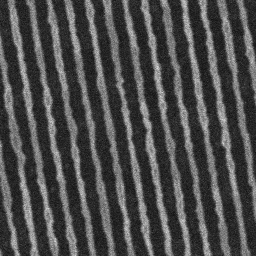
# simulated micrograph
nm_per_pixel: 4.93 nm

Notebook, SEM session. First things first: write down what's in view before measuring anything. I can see parallel lines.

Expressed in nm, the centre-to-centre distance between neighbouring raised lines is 93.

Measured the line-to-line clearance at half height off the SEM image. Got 0.0661 um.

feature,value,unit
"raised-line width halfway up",28.5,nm